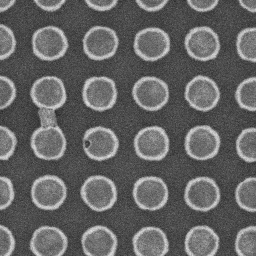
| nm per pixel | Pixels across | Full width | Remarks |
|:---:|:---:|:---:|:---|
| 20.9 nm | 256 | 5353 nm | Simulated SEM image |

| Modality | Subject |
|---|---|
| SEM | a regular array of raised bodies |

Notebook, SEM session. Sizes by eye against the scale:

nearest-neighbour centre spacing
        1040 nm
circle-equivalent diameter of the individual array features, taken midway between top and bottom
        0.673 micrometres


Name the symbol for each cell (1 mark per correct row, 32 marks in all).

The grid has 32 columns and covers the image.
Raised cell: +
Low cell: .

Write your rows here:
+....+++...+++....++....+++...++
................................
................................
+.....+.........................
++..++++...+++...++++...+++...++
++..++++...++++..++++..++++...++
+....+++...+++...++++...+++...++
...............................+
................................
................................
+...++++...+++...+++....+++...++
++..++++...+++...++++..++++...++
+...++++...+++...++++...+++...++
.....++.....+.....++.....+.....+
.....++.........................
.....++.........................
+....+++...+++....++....+++....+
++..++++...+++...++++..++++...++
++..++++...+++...++++..++++...++
+....++....+++....++....++....++
................................
................................
+....++....++.....++....++.....+
+...++++..++++...++++..++++...++
+...++++..++++...++++..++++...++
+....++....+++...+++....+++...++
................................
................................
+...........+..................+
+...++++...+++...+++....+++...++
++..++++..++++...++++..++++...++
+...++++...+++...++++...+++...++